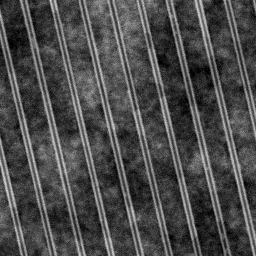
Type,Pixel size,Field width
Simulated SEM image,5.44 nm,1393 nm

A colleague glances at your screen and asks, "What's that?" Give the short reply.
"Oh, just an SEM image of parallel lines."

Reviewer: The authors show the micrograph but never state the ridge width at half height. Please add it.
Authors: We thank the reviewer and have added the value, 23.9 nm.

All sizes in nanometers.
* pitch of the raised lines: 154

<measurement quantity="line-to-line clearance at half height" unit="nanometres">128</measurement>